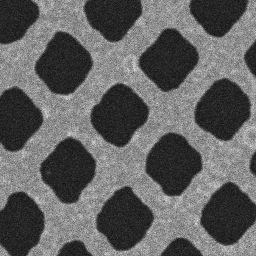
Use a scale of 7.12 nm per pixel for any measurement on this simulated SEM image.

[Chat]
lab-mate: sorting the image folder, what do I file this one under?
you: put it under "holes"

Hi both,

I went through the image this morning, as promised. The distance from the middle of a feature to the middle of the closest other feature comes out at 522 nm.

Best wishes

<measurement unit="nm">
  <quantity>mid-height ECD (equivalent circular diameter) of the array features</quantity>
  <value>404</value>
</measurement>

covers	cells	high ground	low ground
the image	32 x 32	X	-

-----XXXXXX-------XXXXXX-------X
-----XXXXXX-------XXXXXX-------X
-----XXXXXX------XXXXXXX------XX
----XXXXXXXX----XXXXX-XXX----XXX
---XXXX--XXXX---XXXX---XXX--XXXX
-XXXXX----XXXXXXXXX-----XXXXXXX-
XXXXX------XXXXXXX-------XXXXXX-
XXXXX-------XXXXX--------XXXXXX-
XXXX-------XXXXXX-------XXXXXXX-
XXXXX------XXXXXXX-----XXXXXXXXX
XXXXXX----XXXX-XXXX----XXXX---XX
---XXX---XXXX----XXXXXXXXX-----X
----XXXXXXXXX-----XXXXXXX------X
-----XXXXXXX-------XXXXX-------X
-----XXXXXX--------XXXXX-------X
-----XXXXXX-------XXXXXXX------X
-----XXXXXXX-----XXXXXXXXX----XX
----XXXX--XXX---XXXX---XXXX--XXX
X--XXXX----XXXXXXXX-----XXXXXXXX
XXXXXX------XXXXXX-------XXXXXX-
XXXXX-------XXXXXX-------XXXXXX-
XXXXX-------XXXXXX-------XXXXXX-
XXXXX-------XXXXXXX-----XXXXXXXX
XXXXXX-----XXXX-XXXX---XXXX---XX
X---XXX---XXXX---XXXX-XXXX-----X
X----XXX-XXXX-----XXXXXXXX------
-----XXXXXXX-------XXXXXX-------
------XXXXXX-------XXXXXX-------
------XXXXXX-------XXXXXX------X
-----XXXXXXXX-----XXXXXXXX----XX
-----XXX---XXX---XXXX---XXX--XXX
X---XXX----XXXXXXXXX-----XXXXXXX